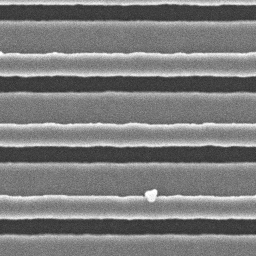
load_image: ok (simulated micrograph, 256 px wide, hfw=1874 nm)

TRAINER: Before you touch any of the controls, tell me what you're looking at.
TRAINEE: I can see lines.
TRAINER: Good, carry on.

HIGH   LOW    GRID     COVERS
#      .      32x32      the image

####################..##########
................................
................................
################################
################################
################################
################################
################################
################################
...#......#.........#.........#.
................................
................................
################################
################################
################################
################################
################################
################################
................................
................................
.###........#...#######.##...###
################################
################################
################################
################################
################################
################################
................................
................................
###.###########.########.#######
################################
################################